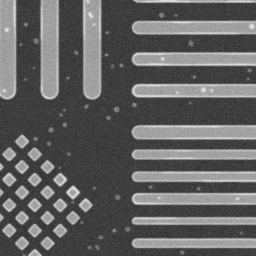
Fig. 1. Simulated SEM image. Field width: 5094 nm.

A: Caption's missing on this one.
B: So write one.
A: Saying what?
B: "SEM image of groups of lines, slits or small figures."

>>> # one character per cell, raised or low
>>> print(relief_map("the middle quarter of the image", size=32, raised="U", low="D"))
DDDDDUUUUDDDDDDDDDDDDDDDDDDDDDDD
DDDDDUUUUDDDDDDDDDDDDDDDDDDDDDDD
DDDDDUUUUDDDDDDDDDDDDDDDDDDDDDDD
DDDDDUUUUDDDDDDDDDDDDDDDDDDDDDDD
DDDDDUUUUDDDDDDDDDDDDDDDDDDDDDDD
DDDDDUUUUDDDDDDDDDUUUUUUUUUUUUUU
DDDDDUUUUDDDDDDDDUUUUUUUUUUUUUUU
DDDDDUUUUDDDDDDDDDUUUUUUUUUUUUUU
DDDDDDUUDDDDDDDDDDDDDDDDDDDDDDDD
DDDDDDDDDDDDDDDDDDDDDDDDDDDDDDDD
DDDDDDDDDDDDDDDDDDDDDDDDDDDDDDDD
DDDDDDDDDDDDDDDDDDDDDDDDDDDDDDDD
DDDDDDDDDDDDDDDDDDDDDDDDDDDDDDDD
DDDDDDDDDDDDDDDDDDDDDDDDDDDDDDDD
DDDDDDDDDDDDDDDDDDDDDDDDDDDDDDDD
DDDDDDDDDDDDDDDDDDUUUDDDDDDDDDDD
DDDDDDDDDDDDDDDDDUUUUUUUUUUUUUUU
DDDDDDDDDDDDDDDDDUUUUUUUUUUUUUUU
DDDDDDDDDDDDDDDDDDUUUUUUUUUUUUUU
DDDDDDDDDDDDDDDDDDDDDDDDDDDDDDDD
DDDDDDDDDDDDDDDDDDDDDDDDDDDDDDDD
DDDDDDDDDDDDDDDDDDDDDDDDDDDDDDDD
DDDDDDDDDDDDDDDDDUUUUUUUUUUUUUUU
DDDDDDDDDDDDDDDDDDUUUUUUUUUUUUUU
DDDDDDDDDDDDDDDDDDDDDDDDDDDDDDDD
DDDDDDDDDDDDDDDDDDDDDDDDDDDDDDDD
DDDDDDDDDDDDDDDDDDDDDDDDDDDDDDDD
DDDDDDDDDDDDDDDDDUUUUUUUUUUUUUUU
DDDDDDDDDDDDDDDDDUUUUUUUUUUUUUUU
DDDDDDDDDDDDDDDDDDDDDDDDDDDDDDDD
DDDDDDDDDDDDDDDDDDDDDDDDDDDDDDDD
DUUDDDDDDDDDDDDDDDDDDDDDDDDDDDDD